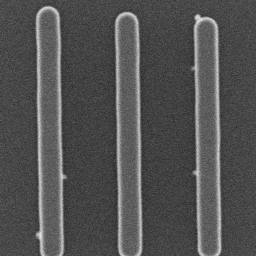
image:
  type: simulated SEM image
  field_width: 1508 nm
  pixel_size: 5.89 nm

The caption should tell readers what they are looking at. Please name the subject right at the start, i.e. groups of lines, slits or small figures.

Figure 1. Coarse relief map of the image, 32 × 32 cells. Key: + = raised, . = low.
................................
.....++.........................
.....++........++........++.....
.....++.......+++.......+++.....
.....++.......+++.......+++.....
.....++.......+++.......+++.....
.....++........++.......+++.....
.....++........++.......+++.....
.....++........++.......+++.....
.....++........++.......+++.....
.....++........++........++.....
.....++........++........++.....
.....+++.......++........++.....
.....+++.......++........++.....
.....+++.......++........++.....
.....+++.......++........++.....
.....+++.......++........++.....
.....+++.......++........++.....
.....+++.......++........++.....
.....+++.......++........++.....
.....+++.......++........++.....
.....+++.......++........++.....
.....+++.......++........++.....
.....+++.......++........++.....
.....+++.......+++.......++.....
.....+++.......+++.......++.....
.....+++.......+++.......+++....
.....+++.......+++.......+++....
.....+++.......+++.......+++....
.....+++.......+++.......+++....
.....+++.......+++.......+++....
.....+++.......+++.......+++....